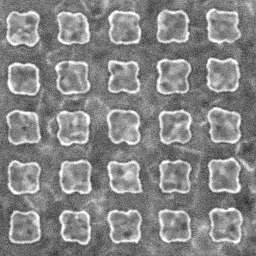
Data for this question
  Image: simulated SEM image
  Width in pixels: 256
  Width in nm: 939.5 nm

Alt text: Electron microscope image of a regular array of raised bodies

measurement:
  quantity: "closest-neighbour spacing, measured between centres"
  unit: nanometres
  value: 180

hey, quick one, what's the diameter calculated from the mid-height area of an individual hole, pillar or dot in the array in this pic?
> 33.4 pixels